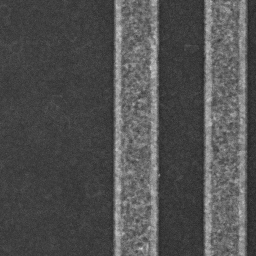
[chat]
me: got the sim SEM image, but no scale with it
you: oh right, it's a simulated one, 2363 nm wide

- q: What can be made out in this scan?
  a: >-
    one or a few lines or trenches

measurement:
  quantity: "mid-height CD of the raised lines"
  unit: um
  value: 0.328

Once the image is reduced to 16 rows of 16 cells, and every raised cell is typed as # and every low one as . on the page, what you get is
.......###...##.
.......###...##.
.......###...##.
.......###...##.
.......###...##.
.......###...##.
.......###...##.
.......###...##.
.......###...##.
.......###...##.
.......###...##.
.......###...##.
.......###...##.
.......###...##.
.......###...##.
.......###...##.